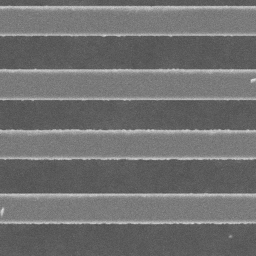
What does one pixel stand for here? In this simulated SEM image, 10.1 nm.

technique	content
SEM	lines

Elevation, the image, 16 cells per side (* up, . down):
****************
****************
................
................
****************
****************
................
................
****************
****************
................
................
****************
****************
................
................